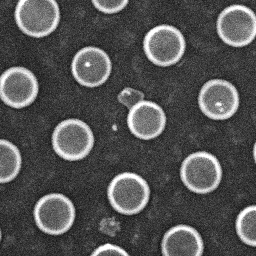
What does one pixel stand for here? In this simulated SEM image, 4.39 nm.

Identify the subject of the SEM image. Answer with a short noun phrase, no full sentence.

a regular array of raised bodies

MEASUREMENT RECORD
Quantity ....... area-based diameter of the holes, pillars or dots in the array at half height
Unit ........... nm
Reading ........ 170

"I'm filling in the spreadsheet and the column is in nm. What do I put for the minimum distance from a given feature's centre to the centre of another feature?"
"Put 330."